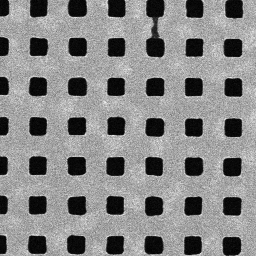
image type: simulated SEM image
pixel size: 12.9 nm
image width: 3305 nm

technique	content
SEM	a regular array of holes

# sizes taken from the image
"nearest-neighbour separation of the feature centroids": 500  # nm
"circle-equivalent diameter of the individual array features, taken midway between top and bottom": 0.262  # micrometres